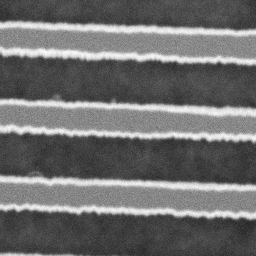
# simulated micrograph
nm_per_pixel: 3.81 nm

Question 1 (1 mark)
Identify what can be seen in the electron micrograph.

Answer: lines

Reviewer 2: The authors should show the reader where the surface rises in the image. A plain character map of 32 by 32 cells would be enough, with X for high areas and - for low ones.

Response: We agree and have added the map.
--------------------------------
--------------------------------
--------------------------------
XXXXXXXXXXXXXXXXXXXX------------
XXXXXXXXXXXXXXXXXXXXXXXXXXXXXXXX
XXXXXXXXXXXXXXXXXXXXXXXXXXXXXXXX
XXXXXXXXXXXXXXXXXXXXXXXXXXXXXXXX
--------------------XXXXXXXXXXXX
--------------------------------
--------------------------------
--------------------------------
--------------------------------
XX------------------------------
XXXXXXXXXXXXXXXXXXXXXXXXXX------
XXXXXXXXXXXXXXXXXXXXXXXXXXXXXXXX
XXXXXXXXXXXXXXXXXXXXXXXXXXXXXXXX
--X-XXXXXXXXXXXXXXXXXXXXXXXXXXXX
--------------------------------
--------------------------------
--------------------------------
--------------------------------
--------------------------------
XXXXXXXXXX-X--------------------
XXXXXXXXXXXXXXXXXXXXXXXXXXXXXXXX
XXXXXXXXXXXXXXXXXXXXXXXXXXXXXXXX
XXXXXXXXXXXXXXXXXXXXXXXXXXXXXXXX
---------X--X-XXXXXXXXXXXXXXXXXX
--------------------------------
--------------------------------
--------------------------------
--------------------------------
--------------------------------